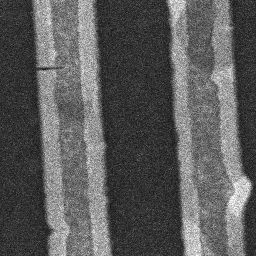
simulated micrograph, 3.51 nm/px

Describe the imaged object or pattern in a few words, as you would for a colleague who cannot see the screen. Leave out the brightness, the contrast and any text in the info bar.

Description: one or a few lines or trenches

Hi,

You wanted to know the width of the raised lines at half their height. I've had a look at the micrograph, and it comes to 156 nanometers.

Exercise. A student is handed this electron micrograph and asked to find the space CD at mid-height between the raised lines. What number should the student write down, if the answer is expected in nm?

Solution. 317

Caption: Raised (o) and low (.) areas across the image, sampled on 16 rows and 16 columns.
...oo......ooo..
...oo......ooo..
...oo......ooo..
...ooo.....ooo..
...ooo.....ooo..
...ooo.....ooo..
...ooo.....ooo..
...ooo.....ooo..
...ooo......oo..
...ooo......oo..
...ooo......ooo.
...ooo......ooo.
...ooo......ooo.
...ooo......ooo.
....oo......ooo.
....oo......ooo.